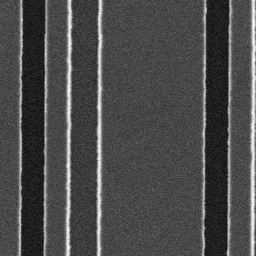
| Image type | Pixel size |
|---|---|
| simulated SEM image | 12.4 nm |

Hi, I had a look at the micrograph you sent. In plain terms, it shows lines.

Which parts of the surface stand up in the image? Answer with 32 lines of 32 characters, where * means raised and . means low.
***...***...**************...***
***...***...**************...***
***...***...**************...***
***...***...**************...***
***...***...**************...***
***...***...**************...***
***...***...**************...***
***...***...**************...***
***...***...**************...***
***...***...**************...***
***...***...**************...***
***...***...**************...***
***...***...**************...***
***...***...**************...***
***...***...**************...***
***...***...**************...***
***...***...**************...***
***...***...**************...***
***...***...**************...***
***...***...**************...***
***...***...**************...***
***...***...**************...***
***...***...**************...***
***...***...**************...***
***...***...*************....***
***...***...**************...***
***...***...**************...***
***...***...**************...***
***...***...*************....***
***...***...*************....***
***...***...**************...***
***...***...*************...****